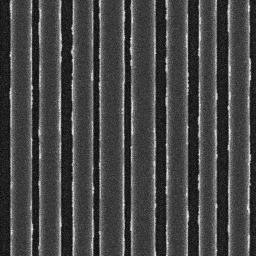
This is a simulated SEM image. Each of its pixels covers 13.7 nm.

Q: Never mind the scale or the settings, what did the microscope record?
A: parallel lines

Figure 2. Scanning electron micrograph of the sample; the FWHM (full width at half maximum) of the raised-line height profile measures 0.294 microns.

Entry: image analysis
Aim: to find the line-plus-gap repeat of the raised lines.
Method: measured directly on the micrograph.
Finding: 428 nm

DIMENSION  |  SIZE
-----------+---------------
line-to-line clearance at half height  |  141 nm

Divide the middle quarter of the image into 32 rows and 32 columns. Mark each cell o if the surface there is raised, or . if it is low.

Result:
..ooooo..oooooo..oooooo...ooooo.
..ooooo..oooooo..oooooo...ooooo.
..ooooo..oooooo..oooooo...ooooo.
..ooooo..oooooo..oooooo...ooooo.
..ooooo..oooooo..oooooo...ooooo.
..ooooo..oooooo..oooooo...ooooo.
..ooooo..oooooo..oooooo...ooooo.
..ooooo..oooooo..oooooo...ooooo.
..ooooo..oooooo..oooooo...ooooo.
..ooooo..oooooo..oooooo...ooooo.
..ooooo..oooooo..oooooo...ooooo.
..ooooo..oooooo..oooooo...ooooo.
..ooooo..oooooo..oooooo...ooooo.
..ooooo..oooooo..oooooo...ooooo.
..ooooo..oooooo..oooooo...ooooo.
..ooooo..oooooo..oooooo...ooooo.
..ooooo..oooooo..oooooo...ooooo.
..ooooo..oooooo..oooooo...ooooo.
..ooooo..oooooo..oooooo...ooooo.
..ooooo..oooooo..oooooo...ooooo.
..ooooo..oooooo..oooooo...ooooo.
..ooooo..oooooo..oooooo...ooooo.
..ooooo..oooooo..oooooo...ooooo.
..ooooo..oooooo..oooooo...ooooo.
..ooooo..oooooo..oooooo...ooooo.
..ooooo..oooooo..oooooo...ooooo.
..ooooo..oooooo..oooooo...ooooo.
..ooooo..oooooo..oooooo...ooooo.
..ooooo..oooooo..oooooo...ooooo.
..ooooo..oooooo..oooooo...ooooo.
..ooooo..oooooo..oooooo...ooooo.
..ooooo..oooooo..oooooo...ooooo.